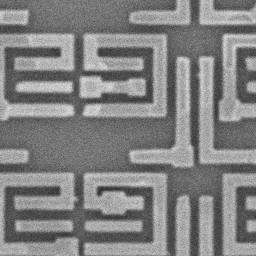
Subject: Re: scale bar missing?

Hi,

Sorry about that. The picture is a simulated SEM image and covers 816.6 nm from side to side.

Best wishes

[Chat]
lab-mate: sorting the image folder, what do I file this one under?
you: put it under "wiring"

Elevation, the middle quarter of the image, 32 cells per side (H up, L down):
HHLLLHHHHHHHHHHHHHHHLLLHHLLLHHHL
HHLLLHHHHHHHHHLLLLHLLLLHHLLLHHHL
LLLLLLLLLLLLLLLLLLLLLLLHHLLLHHHL
LLLLHHHHHLLLLLLLLLLLLLLHHLLLHHHL
LLLLHHHHHHLLLLLHHHHHLLLHHLLLHHHL
HHLLHHHHHHHHHHHHHHHHLLLHHLLLHHHL
HHLLHHHHHHHHHHHHHHHHLLLHHLLLHHHL
LLLLHHHHHLLLLLLLHHHHLLLHHLLLHHHL
LLLLLLLLLLLLLLLLLLLLLLLHHLLLHHHL
LLLLLLLLLLLLLLLLLLLLLLLHHLLLHHHL
HHLLLLHHHHHHHHHHHHHHHHHHHLLLHHHL
HHLLLHHHHHHHHHHHHHHHHHHHHLLLHHHL
HHLLLHHHHHHHHHHHHHHHHHHHHLLLHHHL
LLLLLLLLLLLLLLLLLLLLLLLLLLLLHHHL
LLLLLLLLLLLLLLLLLLLLLLLLLLLLHHHL
LLLLLLLLLLLLLLLLLLLLLLLLLLLLHHHL
LLLLLLLLLLLLLLLLLLLLLLLLLLLLHHHL
LLLLLLLLLLLLLLLLLLLLLLLLLLLLHHHL
LLLLLLLLLLLLLLLLLLLLLLLLLLLLHHHL
LLLLLLLLLLLLLLLLLLLLLLLLLLLLHHHL
LLLLLLLLLLLLLLLLLLLLLLLLLLLLHHHH
LLLLLLLLLLLLLLLLLLLLLLLLLLLHHHHH
LLLLLLLLLLLLLLLLLHHHHHHHHHHHHHHH
LLLLLLLLLLLLLLLLLHHHHHHHHHHHHHHH
LLLLLLLLLLLLLLLLLHHHHHHHHHHHHHHH
LLLLLLLLLLLLLLLLLLLLLLLLLLLLHHHH
LLLLLLLLLLLLLLLLLLLLLLLLLLLLLLLL
HHLLLHHHHHHHHHHHHHHHHHHHHLLLLLLL
HHLLLHHHHHHHHHHHHHHHHHHHHLLLLLLL
HHLLLHHHHHHHHHHHHHHHHHHHHLLLLLLL
HHLLLHHHHLLLLLLLHHHHHHHHHLLLLLLL
HHLLLHHHLLLLLLLLLLLLLLLHHLLLLLLL